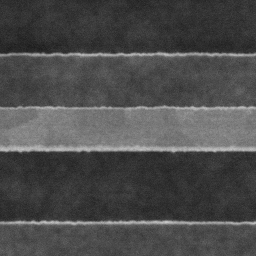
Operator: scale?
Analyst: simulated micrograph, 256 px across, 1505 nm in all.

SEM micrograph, lines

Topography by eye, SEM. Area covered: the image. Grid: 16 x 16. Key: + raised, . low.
................
................
................
++++++++++++++++
++++++++++++++++
++++++++++++++++
++++++++++++++++
++++++++++++++++
++++++++++++++++
................
................
................
................
................
++++++++++++++++
++++++++++++++++